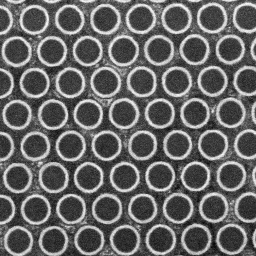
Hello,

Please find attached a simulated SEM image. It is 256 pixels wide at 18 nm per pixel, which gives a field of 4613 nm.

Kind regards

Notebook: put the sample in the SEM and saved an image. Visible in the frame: a regular array of raised bodies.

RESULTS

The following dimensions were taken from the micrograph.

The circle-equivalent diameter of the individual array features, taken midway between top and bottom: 498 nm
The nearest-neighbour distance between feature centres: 640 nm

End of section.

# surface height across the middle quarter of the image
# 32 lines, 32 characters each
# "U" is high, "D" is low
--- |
DDDDDDDDDDDDDDDDDDDDDDDDDDDDDDDD
UUUDDDDDDUUUDDDDDDUUUDDDDDUUUUDD
UUUUDDDDUUUUUDDDDUUUUUDDDUUUUUUD
UUUUUDDUUUUUUUDDUUUUUUUDDUUUUUUD
UUUUUDDUUUUUUUDDUUUUUUUDDUUUUUUU
UUUUUDDUUUUUUUDDUUUUUUUDDUUUUUUD
UUUUDDDDUUUUUDDDDUUUUUDDDDUUUUUD
UUUUDDDDUUUUDDDDDDUUUDDDDDDUUUDD
DDDDDDDDDDDDDDDDDDDDDDDDDDDDDDDD
DDDDUUUDDDDDDUUUUDDDDDUUUUDDDDDU
DDDUUUUUUDDDUUUUUUDDDUUUUUUDDDUU
DDDUUUUUUDDDUUUUUUDDDUUUUUUDDDUU
UDDUUUUUUDDDUUUUUUDDDUUUUUUDDDUU
UDDUUUUUUDDDUUUUUUDDDUUUUUUDDDUU
DDDUUUUUUDDDUUUUUUDDDUUUUUUDDDUU
DDDDDUUUDDDDDUUUUDDDDDDUUDDDDDDU
DDDDDDDDDDDDDDDDDDDDDDDDDDDDDDDD
UUUDDDDDDUUUUDDDDDUUUUDDDDDUUUDD
UUUUUDDDUUUUUUDDDUUUUUDDDDUUUUUD
UUUUUDDUUUUUUUDDDUUUUUUDDUUUUUUD
UUUUUDDUUUUUUUDDDUUUUUUDDUUUUUUU
UUUUUDDDUUUUUUDDDUUUUUUDDUUUUUUD
UUUUDDDDUUUUUDDDDUUUUUDDDDUUUUUD
UUUDDDDDDUUUDDDDDDUUUDDDDDDDDDDD
DDDDDDDDDDDDDDDDDDDDDDDDDDDDDDDD
DDDDUUUUDDDDDUUUUDDDDDUUUUDDDDDU
DDDUUUUUUDDDUUUUUUDDDUUUUUUDDDUU
UDDUUUUUUDDDUUUUUUDDDUUUUUUDDDUU
UDDUUUUUUDDDUUUUUUDDDUUUUUUDDDUU
UDDUUUUUUDDDUUUUUUDDDUUUUUUDDDUU
DDDDUUUUUDDDUUUUUUDDDDUUUUUDDDUU
DDDDDUUUDDDDDDUUDDDDDDDDDDDDDDDD